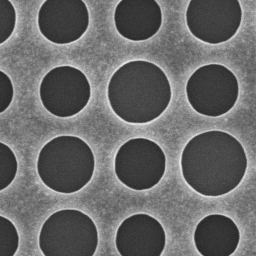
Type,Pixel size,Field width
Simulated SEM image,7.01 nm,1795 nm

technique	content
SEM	holes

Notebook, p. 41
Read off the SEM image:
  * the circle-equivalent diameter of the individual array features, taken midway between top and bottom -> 386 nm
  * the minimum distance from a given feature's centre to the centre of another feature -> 511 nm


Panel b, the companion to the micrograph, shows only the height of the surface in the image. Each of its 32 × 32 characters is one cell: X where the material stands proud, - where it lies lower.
-XXXX------XXXX-----XXXX------XX
--XXX------XXX------XXX-------XX
--XXX------XXX------XXX-------XX
--XXX------XXXX-----XXXX------XX
-XXXX-----XXXXX----XXXXX-----XXX
XXXXXXX-XXXXXXXXXXXXXXXXXXXXXXXX
XXXXXXXXXXXXXXXXXXXXXXXXXXXXXXXX
XXXXXXXXXXXXXXXXXXXXXXXXXXXXXXXX
XXXXXXX---XXXXX-----XXXXX---XXXX
-XXXXX-----XXX-------XXX-----XXX
-XXXX------XXX-------XX-------XX
--XXX------XX--------XX-------XX
-XXXX------XXX-------XXX------XX
-XXXXX----XXXX-------XXX-----XXX
XXXXXXX--XXXXXX-----XXXXXX-XXXXX
XXXXXXXXXXXXXXXXX-XXXXXXXXXXXXXX
XXXXXXXXXXXXXXXXXXXXXXXXXX--XXXX
XXXXXX----XXXXXX---XXXXX------XX
-XXXX------XXXX-----XXX-------XX
--XXX-------XXX------XX--------X
--XXX-------XX-------XX--------X
--XXX-------XX-------XX--------X
--XXX------XXXX-----XXX-------XX
-XXXXX----XXXXXX---XXXXX-----XXX
XXXXXXXXXXXXXXXXXXXXXXXXXX-XXXXX
XXXXXXXXXXXXXXXXXXXXXXXXXXXXXXXX
XXXXXXX---XXXXXXXXXXXXXXXXXXXXXX
-XXXXX-----XXXXX----XXXXX----XXX
--XXX-------XXX-----XXXXX-----XX
--XXX-------XXX------XXX------XX
--XXX-------XXX------XXX------XX
--XXX-------XXX-----XXXXX----XXX